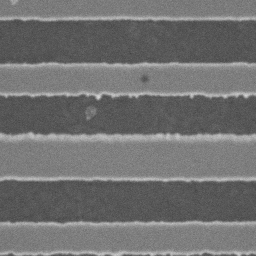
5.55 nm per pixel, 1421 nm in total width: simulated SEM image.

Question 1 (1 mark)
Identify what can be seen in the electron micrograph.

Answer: lines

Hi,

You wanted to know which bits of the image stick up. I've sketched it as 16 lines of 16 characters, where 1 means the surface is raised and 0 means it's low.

1111111111111111
0000000000000000
0000000000000000
0000000000000000
1111111111111111
1111111111111111
0000000000000000
0000000000000000
0100000000100100
1111111111111111
1111111111111111
0000000000000000
0000000000000000
0000000000000000
1111111111111111
1111111111111111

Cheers